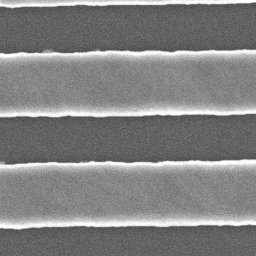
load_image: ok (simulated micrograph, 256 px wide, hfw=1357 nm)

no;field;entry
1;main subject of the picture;lines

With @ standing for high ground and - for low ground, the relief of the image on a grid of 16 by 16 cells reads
----------------
----------------
----------------
@@@@@@@@@@@@@@@@
@@@@@@@@@@@@@@@@
@@@@@@@@@@@@@@@@
@@@@@@@@@@@@@@@@
----------------
----------------
----------------
@@@@@@@@@@@@@@@@
@@@@@@@@@@@@@@@@
@@@@@@@@@@@@@@@@
@@@@@@@@@@@@@@@@
----------------
----------------